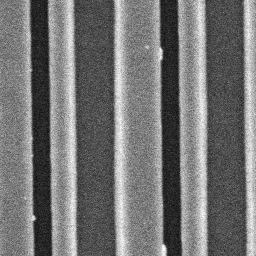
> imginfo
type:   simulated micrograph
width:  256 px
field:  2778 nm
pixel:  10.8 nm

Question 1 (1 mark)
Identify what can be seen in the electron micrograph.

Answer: lines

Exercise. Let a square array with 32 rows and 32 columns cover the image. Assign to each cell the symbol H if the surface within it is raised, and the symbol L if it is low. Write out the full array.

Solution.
HHHHLLHHHLLLLLLHHHHHLLHHHLLLLLLH
HHHHLLHHHLLLLLLHHHHHLLHHHLLLLLLH
HHHHLLHHHLLLLLLHHHHHLLHHHLLLLLLH
HHHHLLHHHLLLLLLHHHHHLLHHHLLLLLLH
HHHHLLHHHLLLLLLHHHHHLLHHHLLLLLLH
HHHHLLHHHLLLLLLHHHHHLLHHHLLLLLLH
HHHHLLHHHLLLLLLHHHHHLLHHHLLLLLLH
HHHHLLHHHLLLLLLHHHHHLLHHHLLLLLLH
HHHHLLHHHLLLLLLHHHHHLLHHHLLLLLLH
HHHHLLHHHLLLLLLHHHHHLLHHHLLLLLLH
HHHHLLHHHLLLLLLHHHHHLLHHHLLLLLLH
HHHHLLHHHLLLLLLHHHHHLLHHHLLLLLLH
HHHHLLHHHLLLLLLHHHHHLLHHHLLLLLLH
HHHHLLHHHLLLLLLHHHHHLLHHHLLLLLLH
HHHHLLHHHLLLLLLHHHHHLLLHHLLLLLLH
HHHHLLHHHLLLLLLHHHHHLLLHHLLLLLLH
HHHHLLHHHLLLLLLHHHHHLLLHHLLLLLLH
HHHHLLHHHLLLLLLHHHHHLLLHHLLLLLLH
HHHHLLHHHLLLLLLHHHHHLLLHHLLLLLLH
HHHHLLHHHLLLLLLHHHHHLLLHHLLLLLLH
HHHHLLHHHLLLLLLHHHHHLLLHHLLLLLLH
HHHHLLHHHLLLLLLHHHHHLLLHHLLLLLLH
HHHHLLHHHLLLLLLHHHHHLLLHHLLLLLLH
HHHHLLHHHLLLLLLHHHHHLLLHHLLLLLLH
HHHHLLHHHLLLLLLHHHHHLLLHHLLLLLLH
HHHHLLHHHLLLLLLHHHHHLLLHHLLLLLLH
HHHHLLHHHLLLLLLHHHHHLLLHHLLLLLLH
HHHHLLLHHLLLLLLHHHHHLLLHHLLLLLLH
HHHHLLLHHLLLLLLHHHHHLLLHHLLLLLLH
HHHHLLLHHLLLLLLHHHHHLLLHHLLLLLLH
HHHHLLLHHLLLLLLHHHHHLLLHHLLLLLLH
HHHHLLLHHLLLLLLHHHHHHLLHHLLLLLLH